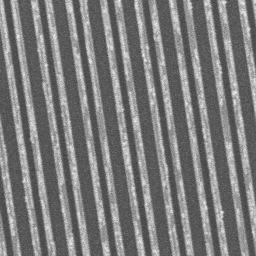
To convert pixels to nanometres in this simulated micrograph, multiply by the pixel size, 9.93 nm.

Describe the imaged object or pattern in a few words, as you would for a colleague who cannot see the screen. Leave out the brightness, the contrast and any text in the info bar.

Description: parallel lines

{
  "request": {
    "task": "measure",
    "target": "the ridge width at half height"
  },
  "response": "65.1 nanometers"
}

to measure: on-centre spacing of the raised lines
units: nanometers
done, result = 170